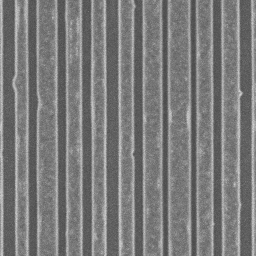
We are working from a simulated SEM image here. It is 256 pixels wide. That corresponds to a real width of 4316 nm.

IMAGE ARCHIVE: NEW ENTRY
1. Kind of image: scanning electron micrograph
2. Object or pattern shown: parallel lines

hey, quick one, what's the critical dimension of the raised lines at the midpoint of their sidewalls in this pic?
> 271 nm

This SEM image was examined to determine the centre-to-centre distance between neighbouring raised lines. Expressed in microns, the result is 0.441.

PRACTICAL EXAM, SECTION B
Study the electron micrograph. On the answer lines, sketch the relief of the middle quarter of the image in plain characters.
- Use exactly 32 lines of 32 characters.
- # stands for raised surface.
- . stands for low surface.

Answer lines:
.###...###....###...####..######
.###...###....###...####..######
.###...###....###...####..######
.###...###....###...####..######
.###...###....###...####..######
.###...###....###...####..######
.###...###....###...####..######
.###...###....###...####..######
.###...###....###...####..######
.###...###....###...####..######
.###...###....###...####..######
.###...###....###...####..######
.###...###....###...####..######
.###...###....###...####..######
.###...###....###...####..######
.###...###....###...####..######
.###...###....###...####..######
.###...###....###...####..######
.###...###....###...####..######
.###...###....###...####..######
.###...###....###...####..######
.###...###....###...####..######
.###...###....###...####..######
.###...###....###...####..######
.###...###....###...####..######
.###...###....###...####..######
.###...###....###...####..######
.###...###....###...####..######
.###...###....###...####..######
.###...###....###...####..######
.###...###....###...####..######
.###...###....###...####..######